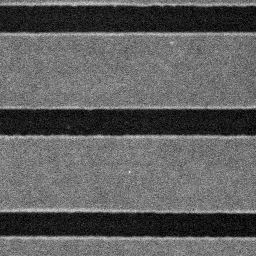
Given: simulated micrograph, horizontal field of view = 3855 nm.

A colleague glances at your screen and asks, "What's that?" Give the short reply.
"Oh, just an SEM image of lines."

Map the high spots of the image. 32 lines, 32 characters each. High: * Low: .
********************************
................................
................................
................................
********************************
********************************
********************************
********************************
********************************
********************************
********************************
********************************
********************************
********************************
................................
................................
................................
********************************
********************************
********************************
********************************
********************************
********************************
********************************
********************************
********************************
..............*.*..*************
................................
................................
................................
********************************
********************************